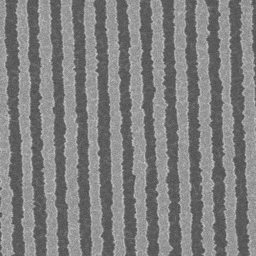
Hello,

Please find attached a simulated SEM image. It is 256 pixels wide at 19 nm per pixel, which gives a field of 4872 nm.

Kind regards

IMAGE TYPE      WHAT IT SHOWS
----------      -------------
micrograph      parallel lines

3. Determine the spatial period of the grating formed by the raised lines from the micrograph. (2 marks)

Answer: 427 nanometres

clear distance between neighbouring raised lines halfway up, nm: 240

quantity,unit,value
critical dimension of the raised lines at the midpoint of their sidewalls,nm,188